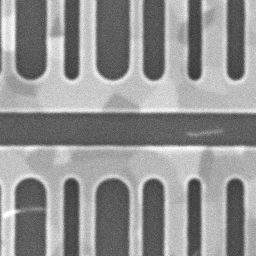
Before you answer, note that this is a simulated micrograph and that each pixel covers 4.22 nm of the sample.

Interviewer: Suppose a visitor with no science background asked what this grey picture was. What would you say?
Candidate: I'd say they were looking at groups of lines, slits or small figures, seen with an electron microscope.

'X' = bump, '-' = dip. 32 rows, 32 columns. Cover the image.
XX----XX--XX----XX---XX--XXX---X
XX----XX--XX----XX---XX--XXX---X
XX----XX--XX----XX---XX--XXX---X
XX----XX--XX----XX---XX--XXX---X
XX----XX--XX----XX---XX--XXX---X
XX----XX--XX----XX---XX--XXX---X
XX----XX--XX----XX---XX--XXX---X
XX----XX--XX----XX---XX--XXX---X
XX----XX--XX----XX---XX--XXX---X
XX---XXX--XX----XX--XXX--XXX---X
XXXXXXXXXXXXXXXXXXXXXXXXXXXXXXXX
XXXXXXXXXXXXXXXXXXXXXXXXXXXXXXXX
XXXXXXXXXXXXXXXXXXXXXXXXXXXXXXXX
XXXXXXXXXXXXXXXXXXXXXXXXXXXXXXXX
--------------------------------
--------------------------------
--------------------------------
--------------------------------
XXXXXXXXXXXXXXXXXXXX-XXXXX---XX-
XXXXXXXXXXXXXXXXXXXXXXXXXXXXXXXX
XXXXXXXXXXXXXXXXXXXXXXXXXXXXXXXX
XXXXXXXXXXXXXXXXXXXXXXXXXXXXXXXX
XXX--XXX--XXX--XXX--XXXX-XXXX-XX
XX----XX--XX----XX---XX--XXX---X
XX----XX--XX----XX---XX--XXX---X
XX----XX--XX----XX---XX--XXX---X
XX----XX--XX----XX---XX--XXX---X
XX----XX--XX----XX---XX--XXX---X
XX----XX--XX----XX---XX--XXX---X
XX----XX--XX----XX---XX--XXX---X
XX----XX--XX----XX---XX--XXX---X
XX----XX--XX----XX---XX--XXX---X